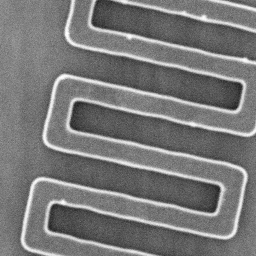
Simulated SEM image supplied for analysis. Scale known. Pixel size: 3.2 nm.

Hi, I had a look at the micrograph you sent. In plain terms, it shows groups of lines, slits or small figures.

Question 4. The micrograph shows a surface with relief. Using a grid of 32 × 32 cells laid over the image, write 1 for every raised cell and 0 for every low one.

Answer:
00000000011100000111111111111000
00000000011000000000011111111111
00000000011000000000000001111111
00000000111100000000000000000011
00000000111111111000000000000000
00000000011111111111100000000000
00000000000001111111111111000000
00000000000000000011111111111110
00000000000000000000000111111111
00000000100000000000000000011111
00000001111110000000000000000011
00000001111111111100000000000011
00000011101111111111110000000011
00000011100000111111111111100011
00000011100000000000111111111111
00000011100000000000000111111111
00000011110000000000000000000111
00000011111111100000000000000000
00000001111111111110000000000000
00000000000111111111111100000000
00000000000000001111111111111000
00000000000000000000111111111100
00000110000000000000000001111110
00001111111000000000000000001100
00001111111111110000000000001100
00001100111111111111100000011100
00011100000011111111111110011100
00011100000000000111111111111100
00011100000000000000001111111100
00011111000000000000000000111000
00011111111100000000000000000000
00001111111111111000000000000000